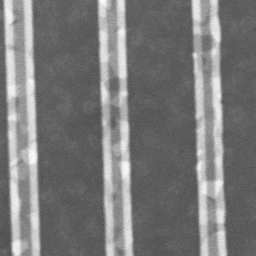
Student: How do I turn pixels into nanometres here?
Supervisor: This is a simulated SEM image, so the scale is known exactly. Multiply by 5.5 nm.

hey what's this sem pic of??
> one or a few lines or trenches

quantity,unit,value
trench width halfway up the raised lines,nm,409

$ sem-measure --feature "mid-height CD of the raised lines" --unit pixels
18.9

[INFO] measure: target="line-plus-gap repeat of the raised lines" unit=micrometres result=0.514